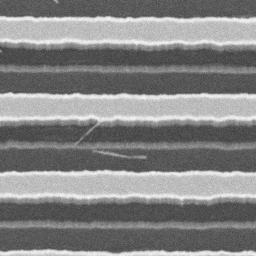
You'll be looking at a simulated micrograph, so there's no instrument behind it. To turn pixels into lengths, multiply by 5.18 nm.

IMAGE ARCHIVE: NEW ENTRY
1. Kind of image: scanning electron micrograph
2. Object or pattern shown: lines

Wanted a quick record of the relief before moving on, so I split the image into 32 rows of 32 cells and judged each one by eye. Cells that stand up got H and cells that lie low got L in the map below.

LLLLLLLLLLLLLLLLLLLLLLLLLLLLLLLL
LLLLLLLLLLLLLLLLLLLLLLLLLLLLLLLL
HHHHHHHHHHHHHHHHHHHHHHHHHHHHHHHH
HHHHHHHHHHHHHHHHHHHHHHHHHHHHHHHH
HHHHHHHHHHHHHHHHHHHHHHHHHHHHHHHH
LLLLLLHLLLHLLLLLLHHHHLLHHLHHHHHH
LLLLLLLLLLLLLLLLLLLLLLLLLLLLLLLL
LLLLLLLLLLLLLLLLLLLLLLLLLLLLLLLL
LLLLLLLLLLLLLLLLLLLLLLLLLLLLLLLL
LLLLLLLLLLLLLLLLLLLLLLLLLLLLLLLL
LLLLLLLLLLLLLLLLLLLLLLLLLLLLLLLL
LLLLLLLLLLLLLLLLLLLLLLLLLLLLLLLL
HHHHHHHHHHHHHHHHHHHHHHHHHHHHHHHH
HHHHHHHHHHHHHHHHHHHHHHHHHHHHHHHH
HHHHHHHHHHHHHHHHHHHHHHHHHHHHHHHH
LLLLLLLLLLLLLLLLLLLLLLLLLLLLLLLL
LLLLLLLLLLLLLLLLLLLLLLLLLLLLLLLL
LLLLLLLLLLLLLLLLLLLLLLLLLLLLLLLL
LLLLLLLLLLLLLLLLLLLLLLLLLLLLLLLL
LLLLLLLLLLLLLLLLLLLLLLLLLLLLLLLL
LLLLLLLLLLLLLLLLLLLLLLLLLLLLLLLL
LHLHHHHHHHHHHHHHLLHHLLLHHHHLLHLL
HHHHHHHHHHHHHHHHHHHHHHHHHHHHHHHH
HHHHHHHHHHHHHHHHHHHHHHHHHHHHHHHH
HHHHHHHHHHHHHHHHHHHHHHHHHHHHHHHH
LLLLLLLLLLLLLLLLLLLLLLLLLLLLLLLL
LLLLLLLLLLLLLLLLLLLLLLLLLLLLLLLL
LLLLLLLLLLLLLLLLLLLLLLLLLLLLLLLL
LLLLLLLLLLLLLLLLLLLLLLLLLLLLLLLL
LLLLLLLLLLLLLLLLLLLLLLLLLLLLLLLL
LLLLLLLLLLLLLLLLLLLLLLLLLLLLLLLL
HHHHHHHHHLLLLLLLLHHHHLLLLHHHLLHH